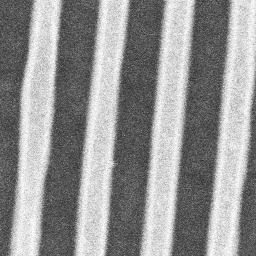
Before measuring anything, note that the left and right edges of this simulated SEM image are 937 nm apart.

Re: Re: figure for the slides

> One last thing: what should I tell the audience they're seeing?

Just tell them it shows one or a few lines or trenches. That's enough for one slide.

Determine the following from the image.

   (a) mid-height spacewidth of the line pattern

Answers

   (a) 42.5 px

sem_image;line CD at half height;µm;0.0879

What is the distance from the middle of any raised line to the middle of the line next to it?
65.9 px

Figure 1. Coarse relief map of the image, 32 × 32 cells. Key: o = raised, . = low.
.....oo......ooo.....ooo.....ooo
....ooo......ooo.....ooo.....ooo
....ooo......ooo.....ooo.....ooo
....ooo.....ooo......ooo.....ooo
....ooo.....ooo......oo......ooo
....ooo.....ooo......oo......ooo
....ooo.....ooo.....ooo......ooo
....ooo.....ooo.....ooo......ooo
...oooo.....ooo.....ooo......ooo
...oooo.....ooo.....ooo......ooo
...oooo.....ooo.....ooo.....ooo.
...oooo.....oo......ooo.....ooo.
...ooo......oo......ooo.....ooo.
...ooo.....ooo......ooo.....ooo.
...ooo.....ooo......ooo.....ooo.
...ooo.....ooo.....oooo.....ooo.
...ooo.....ooo.....ooo......ooo.
...ooo.....ooo.....ooo......ooo.
...ooo.....ooo.....ooo......ooo.
...ooo.....ooo.....ooo.....oooo.
...oo......ooo.....ooo.....ooo..
...oo......ooo.....ooo.....ooo..
...oo.....oooo.....ooo.....ooo..
...oo.....ooo......ooo.....ooo..
...oo.....ooo......ooo.....ooo..
...oo.....ooo......ooo.....ooo..
...oo.....ooo......ooo.....ooo..
..ooo.....ooo......ooo.....ooo..
..oo......ooo.....ooo.....ooo...
..oo......ooo.....ooo.....ooo...
..oo......ooo.....ooo.....ooo...
..oo......ooo.....ooo.....ooo...